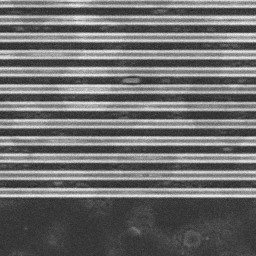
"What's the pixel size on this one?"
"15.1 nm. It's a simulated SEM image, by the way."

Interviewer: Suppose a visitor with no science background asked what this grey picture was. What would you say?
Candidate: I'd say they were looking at parallel lines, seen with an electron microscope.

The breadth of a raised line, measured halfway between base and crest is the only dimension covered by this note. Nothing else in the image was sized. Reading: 115 nm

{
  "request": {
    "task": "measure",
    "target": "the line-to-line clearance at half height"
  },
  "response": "152 nm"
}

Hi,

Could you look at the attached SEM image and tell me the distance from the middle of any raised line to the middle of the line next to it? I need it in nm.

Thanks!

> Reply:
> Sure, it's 260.